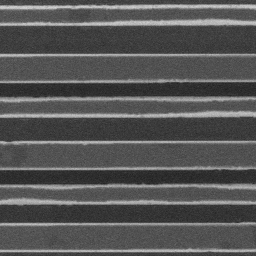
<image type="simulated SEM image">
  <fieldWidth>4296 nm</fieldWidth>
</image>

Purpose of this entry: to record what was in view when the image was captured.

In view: lines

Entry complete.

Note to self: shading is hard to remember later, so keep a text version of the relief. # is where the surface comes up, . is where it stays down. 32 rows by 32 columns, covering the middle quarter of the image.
################################
################################
################################
################################
#################...............
................................
................................
................................
................................
################################
################################
################################
################################
................................
................................
................................
................................
................................
................................
################################
################################
################################
################################
################################
################################
################################
................................
................................
................................
................................
...........####..........#######
################################